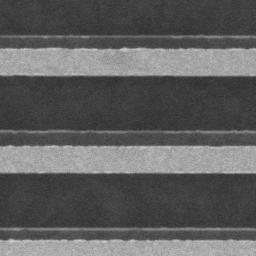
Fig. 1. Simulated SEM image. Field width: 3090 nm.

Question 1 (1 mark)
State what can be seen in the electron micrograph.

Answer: lines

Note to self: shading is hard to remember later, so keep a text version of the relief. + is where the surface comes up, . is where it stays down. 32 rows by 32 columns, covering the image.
................................
................................
................................
................................
................................
++++++++++++++++++++++++++++++++
++++++++++++++++++++++++++++++++
++++++++++++++++++++++++++++++++
++++++++++++++++++++++++++++++++
................................
................................
................................
................................
................................
................................
................................
+++++++++++++++++++++.+++++.++++
++++++++++++++++++++++++++++++++
++++++++++++++++++++++++++++++++
++++++++++++++++++++++++++++++++
++++++++++++++++++++++++++++++++
.+..++.....++++++.++++++++++++++
................................
................................
................................
................................
................................
................................
................................
++++++++++++++++++++++++++++++++
++++++++++++++++++++++++++++++++
++++++++++++++++++++++++++++++++